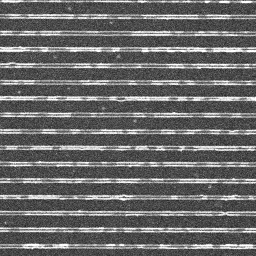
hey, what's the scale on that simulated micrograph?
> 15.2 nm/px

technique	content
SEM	parallel lines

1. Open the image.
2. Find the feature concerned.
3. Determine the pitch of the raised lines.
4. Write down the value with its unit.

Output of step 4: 250 nanometers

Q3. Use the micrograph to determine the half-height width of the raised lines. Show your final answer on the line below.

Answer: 57.1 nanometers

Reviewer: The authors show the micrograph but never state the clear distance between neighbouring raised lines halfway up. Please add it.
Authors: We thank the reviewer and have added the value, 198 nm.